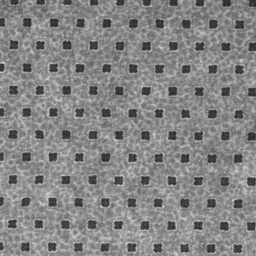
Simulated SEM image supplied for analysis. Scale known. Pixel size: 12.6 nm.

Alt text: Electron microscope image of a regular array of holes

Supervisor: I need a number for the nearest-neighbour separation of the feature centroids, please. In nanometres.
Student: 325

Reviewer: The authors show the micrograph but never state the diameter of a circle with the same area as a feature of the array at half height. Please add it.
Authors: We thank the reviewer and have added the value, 0.128 microns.